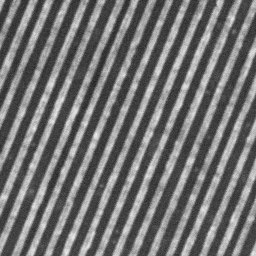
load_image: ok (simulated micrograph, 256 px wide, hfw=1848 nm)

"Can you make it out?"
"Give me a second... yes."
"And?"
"parallel lines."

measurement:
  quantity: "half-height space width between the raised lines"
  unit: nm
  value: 81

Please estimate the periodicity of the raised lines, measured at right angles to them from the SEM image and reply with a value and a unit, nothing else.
0.115 um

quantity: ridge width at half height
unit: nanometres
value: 34.3